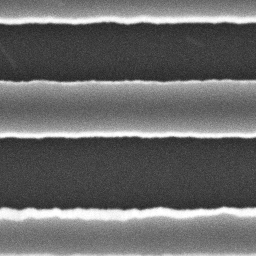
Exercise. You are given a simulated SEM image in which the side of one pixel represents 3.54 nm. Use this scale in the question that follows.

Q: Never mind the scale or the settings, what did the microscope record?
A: lines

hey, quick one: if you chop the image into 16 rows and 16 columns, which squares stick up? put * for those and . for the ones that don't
****************
................
................
................
................
****************
****************
****************
*******..*******
................
................
................
................
****************
****************
****************